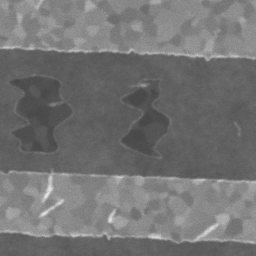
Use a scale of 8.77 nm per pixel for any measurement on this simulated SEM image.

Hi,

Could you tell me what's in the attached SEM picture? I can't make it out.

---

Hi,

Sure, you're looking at one or a few lines or trenches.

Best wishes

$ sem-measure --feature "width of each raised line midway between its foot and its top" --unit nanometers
535